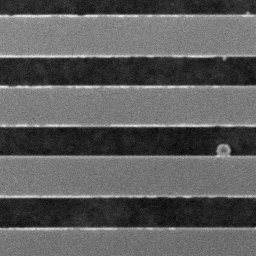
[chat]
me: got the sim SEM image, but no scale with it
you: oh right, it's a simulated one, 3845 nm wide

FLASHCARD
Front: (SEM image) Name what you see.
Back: lines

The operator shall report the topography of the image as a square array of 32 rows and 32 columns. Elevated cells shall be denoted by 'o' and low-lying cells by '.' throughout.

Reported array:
................................
................................
oooooooooooooooooooooooooooooooo
oooooooooooooooooooooooooooooooo
oooooooooooooooooooooooooooooooo
oooooooooooooooooooooooooooooooo
oooooooooooooooooooooooooooooooo
................................
................................
................................
................................
oooooooooooooooooooooooooooooooo
oooooooooooooooooooooooooooooooo
oooooooooooooooooooooooooooooooo
oooooooooooooooooooooooooooooooo
oooooooooooooooooooooooooooooooo
................................
................................
................................
...........................o....
oooooooooooooooooooooooooooooooo
oooooooooooooooooooooooooooooooo
oooooooooooooooooooooooooooooooo
oooooooooooooooooooooooooooooooo
oooooooooooooooooooooooooooooooo
................................
................................
................................
................................
oooooooooooooooooooooooooooooooo
oooooooooooooooooooooooooooooooo
oooooooooooooooooooooooooooooooo